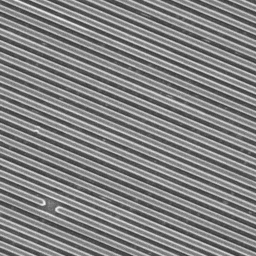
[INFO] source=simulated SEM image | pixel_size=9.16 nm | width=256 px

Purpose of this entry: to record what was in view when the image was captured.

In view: parallel lines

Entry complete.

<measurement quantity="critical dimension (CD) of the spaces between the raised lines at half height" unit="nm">49.7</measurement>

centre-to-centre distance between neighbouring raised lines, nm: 99.8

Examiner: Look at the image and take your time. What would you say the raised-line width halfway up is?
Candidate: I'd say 49.7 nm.